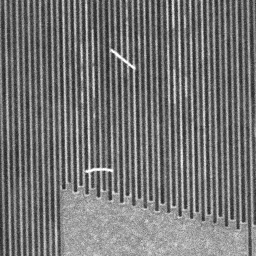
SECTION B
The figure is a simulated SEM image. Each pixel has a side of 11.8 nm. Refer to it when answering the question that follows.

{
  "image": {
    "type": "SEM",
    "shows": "parallel lines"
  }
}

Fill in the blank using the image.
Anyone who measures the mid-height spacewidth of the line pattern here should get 51.6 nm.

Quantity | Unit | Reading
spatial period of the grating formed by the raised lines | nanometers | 68.1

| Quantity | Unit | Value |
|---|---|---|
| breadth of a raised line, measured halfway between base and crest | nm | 20.6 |